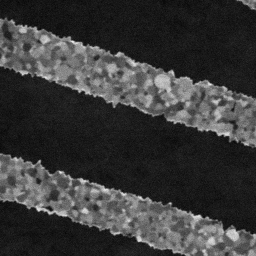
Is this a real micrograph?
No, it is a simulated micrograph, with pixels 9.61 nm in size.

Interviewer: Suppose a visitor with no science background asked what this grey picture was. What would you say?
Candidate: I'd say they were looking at one or a few lines or trenches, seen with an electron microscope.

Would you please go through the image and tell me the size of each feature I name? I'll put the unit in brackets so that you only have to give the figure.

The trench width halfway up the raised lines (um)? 0.816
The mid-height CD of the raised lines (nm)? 400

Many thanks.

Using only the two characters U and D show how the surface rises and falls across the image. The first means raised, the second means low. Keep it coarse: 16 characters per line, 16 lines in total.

DDDDDDDDDDDDDDDD
UDDDDDDDDDDDDDDD
UUUUDDDDDDDDDDDD
UUUUUUUUDDDDDDDD
DUUUUUUUUUUDDDDD
DDDDUUUUUUUUUUDD
DDDDDDDUUUUUUUUU
DDDDDDDDDDDUUUUU
DDDDDDDDDDDDDDUU
DDDDDDDDDDDDDDDD
UUUDDDDDDDDDDDDD
UUUUUUDDDDDDDDDD
UUUUUUUUUDDDDDDD
DDDDUUUUUUUUDDDD
DDDDDDDUUUUUUUUD
DDDDDDDDDDUUUUUU